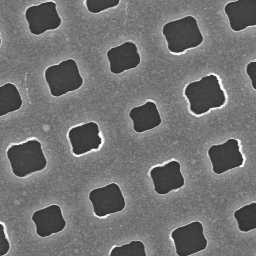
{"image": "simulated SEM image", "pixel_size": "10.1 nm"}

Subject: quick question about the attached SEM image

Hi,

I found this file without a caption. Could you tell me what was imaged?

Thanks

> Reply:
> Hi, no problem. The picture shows a regular array of holes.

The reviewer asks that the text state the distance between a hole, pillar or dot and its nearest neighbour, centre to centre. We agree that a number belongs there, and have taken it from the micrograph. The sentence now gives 633 nm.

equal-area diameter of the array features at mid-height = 332 nm